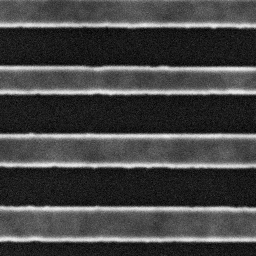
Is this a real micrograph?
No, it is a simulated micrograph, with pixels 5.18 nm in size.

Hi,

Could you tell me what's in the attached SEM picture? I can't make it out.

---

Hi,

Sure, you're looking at lines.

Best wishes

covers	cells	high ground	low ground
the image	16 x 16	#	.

################
################
................
................
################
################
................
................
################
################
................
................
................
################
################
................